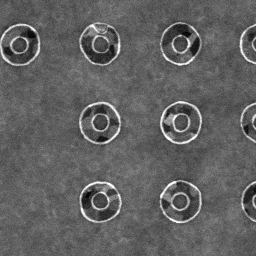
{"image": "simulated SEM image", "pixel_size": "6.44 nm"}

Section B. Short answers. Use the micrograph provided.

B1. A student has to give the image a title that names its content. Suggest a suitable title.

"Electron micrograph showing ring-shaped raised bodies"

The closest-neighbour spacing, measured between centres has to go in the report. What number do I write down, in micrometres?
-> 0.509